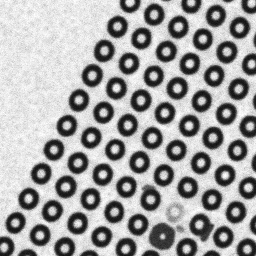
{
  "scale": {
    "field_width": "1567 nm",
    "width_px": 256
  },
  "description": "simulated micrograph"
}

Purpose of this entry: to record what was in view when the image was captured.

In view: a regular array of ring-shaped grooves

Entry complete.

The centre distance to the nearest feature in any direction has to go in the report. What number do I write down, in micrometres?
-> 0.165